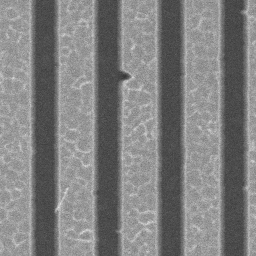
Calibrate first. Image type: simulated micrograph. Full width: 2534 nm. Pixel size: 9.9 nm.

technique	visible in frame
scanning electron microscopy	parallel lines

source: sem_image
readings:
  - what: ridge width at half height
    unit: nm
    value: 385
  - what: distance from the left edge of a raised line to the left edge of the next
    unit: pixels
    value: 63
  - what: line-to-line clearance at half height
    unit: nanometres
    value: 241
